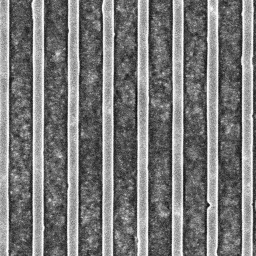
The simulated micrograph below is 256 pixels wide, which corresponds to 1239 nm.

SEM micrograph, parallel lines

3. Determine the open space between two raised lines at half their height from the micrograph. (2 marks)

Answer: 124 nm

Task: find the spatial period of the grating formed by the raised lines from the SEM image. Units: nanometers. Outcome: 169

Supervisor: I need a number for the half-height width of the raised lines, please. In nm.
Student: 44.8